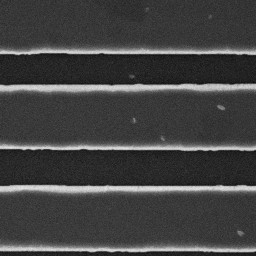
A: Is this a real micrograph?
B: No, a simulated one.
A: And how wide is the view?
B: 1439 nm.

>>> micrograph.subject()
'lines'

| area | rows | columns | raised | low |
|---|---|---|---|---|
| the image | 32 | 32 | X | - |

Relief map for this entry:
XXXXXXXXXXXXXXXXXXXXXXXXXXXXXXXX
XXXXXXXXXXXXXXXXXXXXXXXXXXXXXXXX
XXXXXXXXXXXXXXXXXXXXXXXXXXXXXXXX
XXXXXXXXXXXXXXXXXXXXXXXXXXXXXXXX
XXXXXXXXXXXXXXXXXXXXXXXXXXXXXXXX
XXXXXXXXXXXXXXXXXXXXXXXXXXXXXXXX
XXXXXXXXXXXXXXXXXXXXXXXXXXXXXXXX
--------------------------------
--------------------------------
--------------------------------
--------------------------------
XXXXXXXXXXXXXXXXXXXXXXXXXXXXXXXX
XXXXXXXXXXXXXXXXXXXXXXXXXXXXXXXX
XXXXXXXXXXXXXXXXXXXXXXXXXXXXXXXX
XXXXXXXXXXXXXXXXXXXXXXXXXXXXXXXX
XXXXXXXXXXXXXXXXXXXXXXXXXXXXXXXX
XXXXXXXXXXXXXXXXXXXXXXXXXXXXXXXX
XXXXXXXXXXXXXXXXXXXXXXXXXXXXXXXX
XXXXXXXXXXXXXXXXXXXXXXXXXXXXXXXX
--------------------------------
--------------------------------
--------------------------------
--------------------------------
XXXXXXXXX-XXXXXXXXXXXXXXXXXXXXXX
XXXXXXXXXXXXXXXXXXXXXXXXXXXXXXXX
XXXXXXXXXXXXXXXXXXXXXXXXXXXXXXXX
XXXXXXXXXXXXXXXXXXXXXXXXXXXXXXXX
XXXXXXXXXXXXXXXXXXXXXXXXXXXXXXXX
XXXXXXXXXXXXXXXXXXXXXXXXXXXXXXXX
XXXXXXXXXXXXXXXXXXXXXXXXXXXXXXXX
XXXXXXXXXXXXXXXXXXXXXXXXXXXXXXXX
--------------------------------